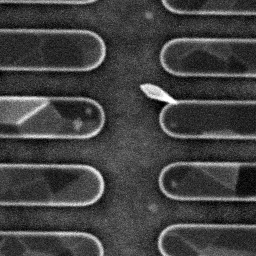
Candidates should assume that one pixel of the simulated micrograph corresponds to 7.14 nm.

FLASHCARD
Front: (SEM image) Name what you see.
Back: groups of lines, slits or small figures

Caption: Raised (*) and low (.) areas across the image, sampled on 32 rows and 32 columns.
....................************
......................**********
................................
................................
************....................
*************........***********
*************.......************
*************.......************
************.........***********
.............................***
................................
..................**............
***********.........**..........
*************........***********
*************.......************
*************.......************
************.........***********
................................
................................
................................
......................**********
************........************
*************.......************
*************.......************
************.........***********
***********.....................
................................
................................
.....................***********
************........************
*************.......************
*************.......************